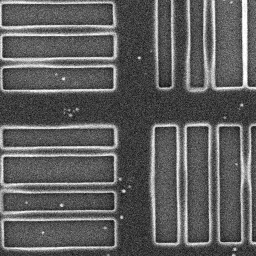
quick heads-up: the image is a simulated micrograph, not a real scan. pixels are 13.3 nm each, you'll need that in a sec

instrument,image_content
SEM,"groups of lines, slits or small figures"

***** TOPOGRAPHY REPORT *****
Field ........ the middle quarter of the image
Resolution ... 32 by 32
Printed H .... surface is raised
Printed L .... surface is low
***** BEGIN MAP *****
HHHHHHHHLLLLHHHHHHHHHHHLLLLHHHHL
LLLLLLLLLLLLLHHHHHHHHHHLLLLHHHHL
LLLLLLLLLLLLLHHHHHHHHHHLLLLHHHHL
LLLLLLLLLLLLLHHHHHHHHHHLLLLHHHHL
LLLLLLLLLLLLLHHHHHHHHHHLLLLHHHHL
LLLLLLLLLLLLLHHHHHHHHHHHLLLHHHHL
LLLLLLLLLLLLHHHHHHHHHHHHHHHHHHHH
HHHHHHHHHHHHHHHHHHHHHHHHHHHHHHHH
HHHHHHHHHHHHHHHHHHHHHHHHHHHHHHHH
HHHHHHHHHHHHHHHHHHHHHHHHHHHHHHHH
HHHHHHHHHHHHHHHHHHHHHHHHHHHHHHHH
HHHHHHHHHHHHHHHHHHHHHHHHHHHHHHHH
HHHHHHHHHHHHHHHHHHHHHHHHHHHHHHHH
HHHHHHHHHHHHHHHHHHHHHHHHHHHHHHHH
HHHHHHHHHHHHHHHHHHHHHHHHHHHHHHHH
HHHHHHHHHHHHHHHHHHHHHHHHHHLLHHHL
LLLLLLLLLLLLLHHHHHHHHHLLLLLLHHLL
LLLLLLLLLLLLLHHHHHHHHHLLLLLLHHLL
LLLLLLLLLLLLLHHHHHHHHHLLLLLLHHLL
LLLLLLLLLLLLLHHHHHHHHHLLLLLLHHLL
LLLLLLLLLLLLLHHHHHHHHHLLLLLLHHLL
HHHHHHHHHHHHHHHHHHHHHHLLLLLLHHLL
HHHHHHHHHHHHHHHHHHHHHHLLLLLLHHLL
LLLLLLLLLLLLLHHHHHHHHHLLLLLLHHLL
LLLLLLLLLLLLLHHHHHHHHHLLLLLLHHLL
LLLLLLLLLLLLLHHHHHHHHHLLLLLLHHHL
LLLLLLLLLLLLLHHHHHHHHHLLLLLLHHHL
LLLLLLLLLLLLLHHHHHHHHHLLLLLLHHHL
LLLLLLLLLLLLLHHHHHHHHHLLLLLLHHHL
LLLLLLLLLLLLHHHHHHHHHHLLLLLLHHHL
HHHHHHHHHHHHHHHHHHHHHHLLLLLLHHHL
HHHHHHHHHHHHHHHHHHHHHHLLLLLLHHHL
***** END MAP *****